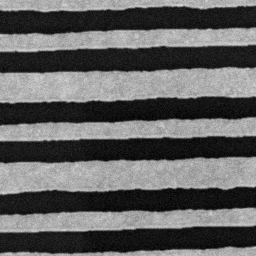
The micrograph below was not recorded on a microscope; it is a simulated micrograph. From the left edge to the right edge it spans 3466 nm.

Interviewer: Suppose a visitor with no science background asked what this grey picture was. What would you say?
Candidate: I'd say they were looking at lines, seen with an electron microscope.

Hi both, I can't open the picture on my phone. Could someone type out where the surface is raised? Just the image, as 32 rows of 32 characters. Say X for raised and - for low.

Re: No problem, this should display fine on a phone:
XXXXXXXXXXXXXXXXXXXXXXXXXXXXXXXX
--------------------------------
--------------------------------
--------------------------------
XXXXXXXXXXXXXXXXXXXXXXXXXXXXXXXX
XXXXXXXXXXXXXXXXXXXXXXXXXXXXXXXX
--------------------------------
--------------------------------
--------------------------------
XXXXXXXXXXXXXXXXXXXXXXXXXXXXXXXX
XXXXXXXXXXXXXXXXXXXXXXXXXXXXXXXX
XXXXXXXXXXXXXXXXXXXXXXXXXXXXXXXX
XXXXXXXXXXXXXX------------------
--------------------------------
--------------------------------
----XXXXXXXXXXXXXXXXXXXXXXXXXXXX
XXXXXXXXXXXXXXXXXXXXXXXXXXXXXXXX
-X------------------------------
--------------------------------
--------------------------------
XXXXXXXXXXXXXXXXXXXXXXXXXXXXXXXX
XXXXXXXXXXXXXXXXXXXXXXXXXXXXXXXX
XXXXXXXXXXXXXXXXXXXXXXXXXXXXXXXX
XXXXXXXXXXXXXXXXXXXXXX-XXX-XX---
--------------------------------
--------------------------------
-------------X-XXXXXXXXXXXXXXXXX
XXXXXXXXXXXXXXXXXXXXXXXXXXXXXXXX
XXXXXXXXXXXXXXXXX---------------
--------------------------------
--------------------------------
-----------------XXXXXXXXXXXXXXX